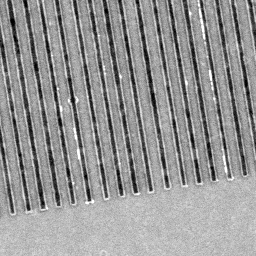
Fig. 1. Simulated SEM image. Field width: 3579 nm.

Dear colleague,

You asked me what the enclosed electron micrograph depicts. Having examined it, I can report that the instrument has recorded parallel lines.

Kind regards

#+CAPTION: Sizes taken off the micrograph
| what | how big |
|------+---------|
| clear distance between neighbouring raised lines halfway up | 0.147 um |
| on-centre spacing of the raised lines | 219 nanometers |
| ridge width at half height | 74.1 nm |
